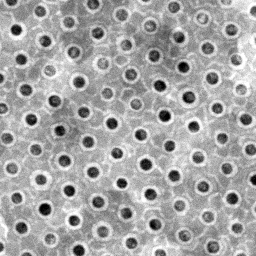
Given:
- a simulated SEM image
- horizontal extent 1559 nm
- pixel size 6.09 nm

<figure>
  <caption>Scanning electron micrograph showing a regular array of holes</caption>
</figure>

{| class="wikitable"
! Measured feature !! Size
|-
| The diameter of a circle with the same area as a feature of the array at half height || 0.0786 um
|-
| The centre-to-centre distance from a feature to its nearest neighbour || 183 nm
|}